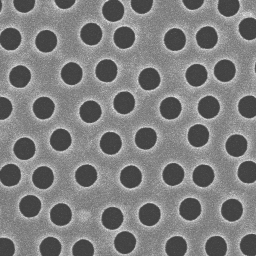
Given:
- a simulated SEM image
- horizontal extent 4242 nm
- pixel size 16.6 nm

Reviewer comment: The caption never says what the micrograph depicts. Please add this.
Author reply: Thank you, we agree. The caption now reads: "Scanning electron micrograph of a regular array of holes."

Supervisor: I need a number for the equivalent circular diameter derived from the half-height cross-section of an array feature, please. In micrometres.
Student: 0.376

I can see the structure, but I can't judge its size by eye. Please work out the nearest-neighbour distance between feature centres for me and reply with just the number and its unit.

573 nanometers